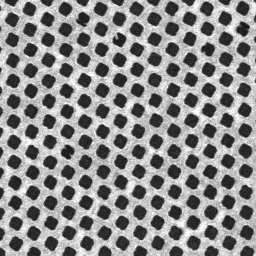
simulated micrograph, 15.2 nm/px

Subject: a regular array of holes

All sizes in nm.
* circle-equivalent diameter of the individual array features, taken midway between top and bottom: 213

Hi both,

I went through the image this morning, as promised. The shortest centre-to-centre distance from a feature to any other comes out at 307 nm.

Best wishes